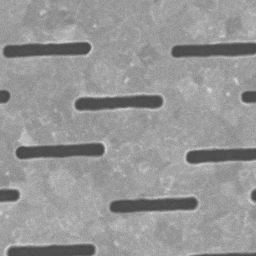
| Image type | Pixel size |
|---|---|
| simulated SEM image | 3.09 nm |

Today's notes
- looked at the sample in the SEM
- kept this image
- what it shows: holes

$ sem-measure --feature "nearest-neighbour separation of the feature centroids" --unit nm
257